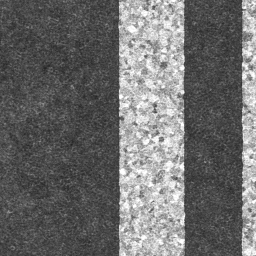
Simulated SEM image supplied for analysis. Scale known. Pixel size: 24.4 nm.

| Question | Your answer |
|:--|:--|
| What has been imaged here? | one or a few lines or trenches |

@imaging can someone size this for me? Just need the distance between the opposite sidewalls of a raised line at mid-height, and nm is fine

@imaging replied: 1560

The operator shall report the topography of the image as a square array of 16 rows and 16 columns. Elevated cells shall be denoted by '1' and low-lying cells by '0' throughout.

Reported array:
0000000011100001
0000000111100001
0000000111100001
0000000111100001
0000000111100001
0000000111100001
0000000011100001
0000000111100001
0000000011100001
0000000011100001
0000000011100001
0000000111100001
0000000011100001
0000000011100001
0000000011100001
0000000011100001